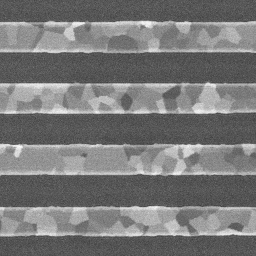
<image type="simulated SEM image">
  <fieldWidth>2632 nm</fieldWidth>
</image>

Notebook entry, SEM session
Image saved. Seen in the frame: lines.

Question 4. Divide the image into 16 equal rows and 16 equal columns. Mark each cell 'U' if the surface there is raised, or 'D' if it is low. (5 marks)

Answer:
DDDDDDDDDDDDDDDD
UUUUUUUUUUUUUUUU
UUUUUUUUUUUUUUUU
DDDDDDDDDDDDDDDD
DDDDDDDDDDDDDDDD
UUUUUUUUUUUUUUUU
UUUUUUUUUUUUUUUU
DDDDDDDDDDDDDDDD
DDDDDDDDDDDDDDDD
UUUUUUUUUUUUUUUU
UUUUUUUUUUUUUUUU
DDDDDDDDDDDDDDDD
DDDDDDDDDDDDDDDD
UUUUUUUUUUUUUUUU
UUUUUUUUUUUUUUUU
DDDDDDDDDDDDDDDD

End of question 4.